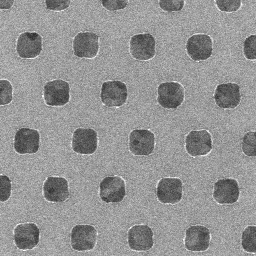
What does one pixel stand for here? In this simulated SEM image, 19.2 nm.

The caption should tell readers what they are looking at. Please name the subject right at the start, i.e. a regular array of raised bodies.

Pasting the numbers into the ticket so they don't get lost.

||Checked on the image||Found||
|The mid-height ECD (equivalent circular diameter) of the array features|545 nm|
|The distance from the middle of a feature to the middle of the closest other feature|1060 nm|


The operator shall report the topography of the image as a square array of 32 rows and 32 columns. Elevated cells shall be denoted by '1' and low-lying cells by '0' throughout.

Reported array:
11000011100001110000111000011100
00000000000000000000000000001000
00000000000000000000000000000000
00000000000000000000000000000000
00111000011100000110000011000001
00111000011100001110000111100011
00111000011100001110000111100011
00000000000000000110000011000000
00000000000000000000000000000000
00000000000000000000000000000000
10000011100001110000111000001100
11000111100001110000111000011100
11000011100001110000111000011100
00000000000000000000110000001000
00000000000000000000000000000000
00000000000000000000000000000000
00111000011100001110000011000001
00111000011100001110000111000011
00111000011100001110000111000011
00000000000000000000000010000001
00000000000000000000000000000000
00000000000000000000000000000000
10000011000001100000111000011000
10000111100011110000111000011100
10000111100011110000111000011100
00000000000000000000000000010000
00000000000000000000000000000000
00000000000000000000000000000000
00111000011100001110000111000001
00111000011100001110000111000011
00111000011100001110000111000011
00000000000000000000000000000001